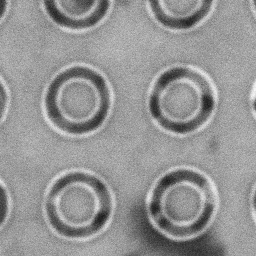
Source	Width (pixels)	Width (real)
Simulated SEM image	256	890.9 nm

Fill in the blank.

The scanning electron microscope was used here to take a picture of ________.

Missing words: ring-shaped raised bodies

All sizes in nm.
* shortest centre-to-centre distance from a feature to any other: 358